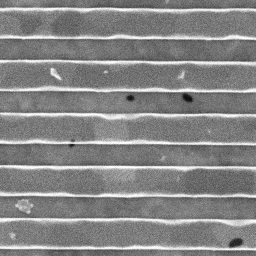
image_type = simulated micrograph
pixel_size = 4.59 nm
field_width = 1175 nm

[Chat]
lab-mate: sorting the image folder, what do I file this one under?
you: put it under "wiring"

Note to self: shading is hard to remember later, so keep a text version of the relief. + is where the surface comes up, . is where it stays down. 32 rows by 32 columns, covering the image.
................................
++++++++++++++++++++++++++++++++
++++++++++++++++++++++++++++++++
++++++++++++++++++++++++++++++++
++++++++++++++++++++++++++++++++
................................
................................
................................
++++++++++++++++++++++++++++++++
++++++++++++++++++++++++++++++++
++++++++++++++++++++++++++++++++
................................
................................
................................
+++++++++++++....+++++++++++++++
++++++++++++++++++++++++++++++++
++++++++++++++++++++++++++++++++
++++++++++++++++++++++++++++++++
................................
................................
................................
++++++++++++++++++++++++++++++++
++++++++++++++++++++++++++++++++
++++++++++++++++++++++++++++++++
..........+++..++....+.++.++++.+
................................
................................
++++++++++++++++++++....++++....
++++++++++++++++++++++++++++++++
++++++++++++++++++++++++++++++++
++++++++++++++++++++++++++++++++
................................